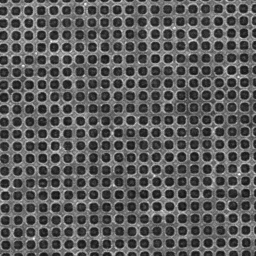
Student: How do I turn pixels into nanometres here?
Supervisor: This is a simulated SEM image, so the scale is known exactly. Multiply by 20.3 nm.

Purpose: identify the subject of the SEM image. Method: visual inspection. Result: a regular array of holes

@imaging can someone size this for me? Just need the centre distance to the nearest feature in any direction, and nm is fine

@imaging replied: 242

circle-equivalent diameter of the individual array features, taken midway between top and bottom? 202 nanometres